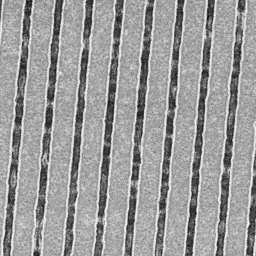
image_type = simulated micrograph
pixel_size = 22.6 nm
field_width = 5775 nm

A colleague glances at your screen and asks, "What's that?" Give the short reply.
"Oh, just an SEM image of parallel lines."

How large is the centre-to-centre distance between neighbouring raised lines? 0.683 um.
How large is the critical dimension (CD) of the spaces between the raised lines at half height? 211 nm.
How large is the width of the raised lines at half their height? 480 nm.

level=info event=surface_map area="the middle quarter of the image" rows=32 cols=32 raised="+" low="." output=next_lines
++++..+++++...+++++..+++++...+++
++++..+++++...+++++..++++++..+++
++++..+++++...+++++..+++++...+++
++++..+++++...+++++..+++++...+++
++++..+++++..++++++..+++++...+++
+++...+++++...++++...+++++...+++
+++...+++++..+++++...+++++...+++
+++..++++++..+++++...+++++..++++
+++..++++++..+++++...+++++..++++
+++..++++++..+++++...+++++..++++
+++..++++++..+++++...+++++..++++
+++..+++++...+++++..++++++..++++
+++..+++++...+++++..+++++...++++
+++..+++++...+++++..+++++...++++
++...+++++...+++++..+++++...++++
++...+++++..++++++..+++++...++++
++...+++++..+++++...+++++...++++
++...+++++..+++++...+++++...++++
++...+++++..+++++...+++++...++++
++...+++++..+++++...+++++..+++++
++..+++++...+++++..++++++..+++++
++..+++++...+++++...+++++..+++++
++..+++++...+++++...+++++..+++++
++..+++++...+++++..++++++..+++++
++..+++++...+++++...+++++..+++++
+...+++++...+++++..+++++...+++++
+...+++++...+++++..+++++...+++++
+...+++++...+++++..+++++...+++++
+...+++++..+++++...+++++..++++++
+...+++++..+++++...+++++...+++++
+...+++++..+++++...+++++...++++.
+...+++++..+++++...+++++..++++++